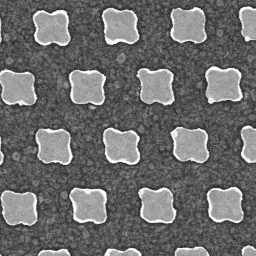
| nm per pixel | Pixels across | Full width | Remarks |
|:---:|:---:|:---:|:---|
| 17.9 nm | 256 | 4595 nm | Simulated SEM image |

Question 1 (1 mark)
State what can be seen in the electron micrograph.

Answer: a regular array of raised bodies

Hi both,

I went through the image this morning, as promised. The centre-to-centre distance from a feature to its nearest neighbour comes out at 1210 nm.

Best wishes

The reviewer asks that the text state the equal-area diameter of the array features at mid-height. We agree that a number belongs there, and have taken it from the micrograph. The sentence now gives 652 nm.